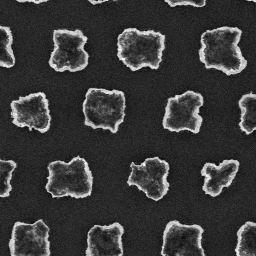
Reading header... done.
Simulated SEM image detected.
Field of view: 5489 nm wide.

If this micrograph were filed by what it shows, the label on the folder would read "a regular array of raised bodies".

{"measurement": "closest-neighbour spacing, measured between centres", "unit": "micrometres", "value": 1.55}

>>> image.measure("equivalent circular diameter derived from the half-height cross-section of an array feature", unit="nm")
861